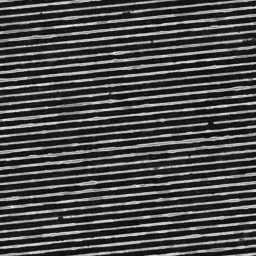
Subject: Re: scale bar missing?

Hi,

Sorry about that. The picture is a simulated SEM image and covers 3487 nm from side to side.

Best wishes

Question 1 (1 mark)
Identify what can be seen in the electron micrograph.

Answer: parallel lines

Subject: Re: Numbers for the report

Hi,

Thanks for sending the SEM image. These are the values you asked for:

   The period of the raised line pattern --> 108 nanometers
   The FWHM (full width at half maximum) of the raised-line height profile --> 22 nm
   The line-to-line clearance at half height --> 0.078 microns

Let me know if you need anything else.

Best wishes